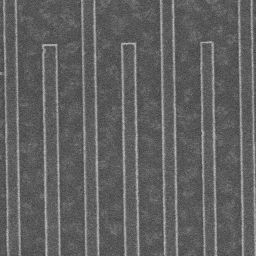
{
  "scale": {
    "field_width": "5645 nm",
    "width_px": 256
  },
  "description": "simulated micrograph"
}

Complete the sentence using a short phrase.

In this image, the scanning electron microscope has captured parallel lines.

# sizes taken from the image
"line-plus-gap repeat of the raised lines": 865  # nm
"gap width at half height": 579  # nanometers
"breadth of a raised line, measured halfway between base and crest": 281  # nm